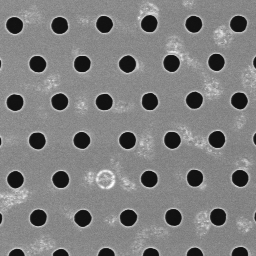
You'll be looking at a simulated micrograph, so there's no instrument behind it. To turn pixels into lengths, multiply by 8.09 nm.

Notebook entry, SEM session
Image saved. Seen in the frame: a regular array of holes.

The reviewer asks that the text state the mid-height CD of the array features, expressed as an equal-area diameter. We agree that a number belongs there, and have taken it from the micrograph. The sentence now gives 134 nm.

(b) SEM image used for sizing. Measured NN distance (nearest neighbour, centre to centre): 358 nm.